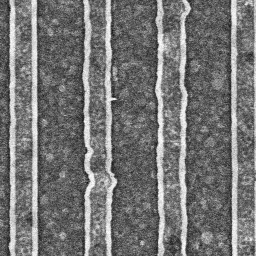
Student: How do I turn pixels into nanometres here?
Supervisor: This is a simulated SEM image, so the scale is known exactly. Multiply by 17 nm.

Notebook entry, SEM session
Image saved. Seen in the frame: one or a few lines or trenches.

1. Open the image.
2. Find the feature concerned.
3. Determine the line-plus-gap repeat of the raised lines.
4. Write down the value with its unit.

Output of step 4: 1260 nm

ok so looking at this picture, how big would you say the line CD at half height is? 0.387 microns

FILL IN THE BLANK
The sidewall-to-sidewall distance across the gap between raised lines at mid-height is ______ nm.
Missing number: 865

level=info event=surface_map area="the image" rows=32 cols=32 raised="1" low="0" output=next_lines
01110000000111000000111000000111
00110000000111000000111000000111
00110000000111000000111000000111
00110000000111000000111000000111
00110000000111000000111000000111
00110000000111000000111000000111
00110000000111000000111000000111
00110000000111000000111000000111
00110000000111000000111000000111
00110000000110000000111000000111
00110000000111000000111000000111
00110000000111000000111000000111
00110000000111000000111000000111
00110000000111000000111000000111
00110000000111000000111000000111
00110000000111000000111000000111
00110000000111000000111000000111
00110000000111000000111000000111
01110000000111000000111000000111
00110000000111000000111000000111
00110000000111000000111000000111
00110000000111000000111000000111
00110000000011000000111000000111
00110000000111000000111000000111
00110000000111000000111000000111
00110000000111000000111000000111
01110000000111000000111000000111
00110000000111000000111000000111
00110000000110000000111000000111
00110000000111000000111000000111
01110000000111000000111000000111
01110000000111000000111000000111